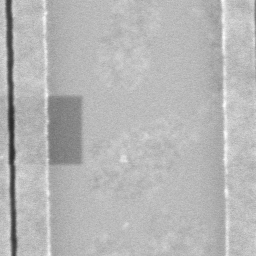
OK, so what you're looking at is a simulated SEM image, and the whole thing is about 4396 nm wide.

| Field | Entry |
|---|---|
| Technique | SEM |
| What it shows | lines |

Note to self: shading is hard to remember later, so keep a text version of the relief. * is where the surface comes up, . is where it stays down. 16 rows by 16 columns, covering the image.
***...........**
***...........**
***...........**
***...........**
***...........**
***...........**
***...........**
***...........**
***...........**
***...........**
***...........**
***...........**
***...........**
***...........**
***...........**
***...........**